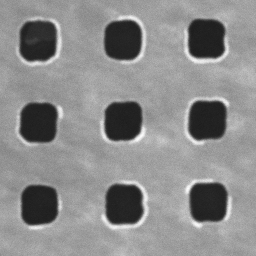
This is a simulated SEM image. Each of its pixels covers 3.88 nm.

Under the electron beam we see a regular array of holes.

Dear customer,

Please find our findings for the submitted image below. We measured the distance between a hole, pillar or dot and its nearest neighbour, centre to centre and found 317 nm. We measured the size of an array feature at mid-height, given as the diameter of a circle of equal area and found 161 nm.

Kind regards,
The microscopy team